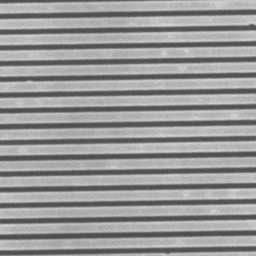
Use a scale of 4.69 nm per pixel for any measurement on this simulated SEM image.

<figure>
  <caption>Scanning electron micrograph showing parallel lines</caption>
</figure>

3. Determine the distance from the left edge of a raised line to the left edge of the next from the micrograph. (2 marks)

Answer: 0.074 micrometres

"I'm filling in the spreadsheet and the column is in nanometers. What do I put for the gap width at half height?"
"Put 28.1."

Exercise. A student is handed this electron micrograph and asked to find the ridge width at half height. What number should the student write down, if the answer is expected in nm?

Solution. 46.9